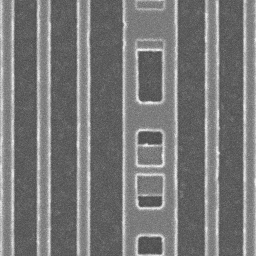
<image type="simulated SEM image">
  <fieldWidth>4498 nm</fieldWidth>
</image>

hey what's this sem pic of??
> parallel lines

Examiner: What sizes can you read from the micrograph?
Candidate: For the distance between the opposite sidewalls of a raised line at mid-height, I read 0.217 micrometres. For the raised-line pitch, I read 0.72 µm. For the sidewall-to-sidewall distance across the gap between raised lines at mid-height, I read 0.492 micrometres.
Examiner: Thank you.